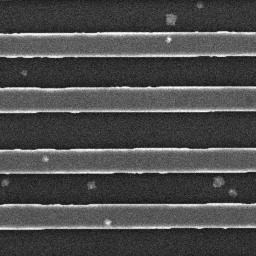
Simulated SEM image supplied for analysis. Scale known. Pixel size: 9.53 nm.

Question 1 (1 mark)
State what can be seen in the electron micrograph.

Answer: lines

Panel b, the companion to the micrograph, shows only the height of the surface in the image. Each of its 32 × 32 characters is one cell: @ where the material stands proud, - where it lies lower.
--------------------------------
--------------------------------
--------------------------------
--------------------------------
@@@@@@@@@@@@@@@@@@@@@@@@@@@@@@@@
@@@@@@@@@@@@@@@@@@@@@@@@@@@@@@@@
@@@@@@@@@@@@@@@@@@@@@@@@@@@@@@@@
--------------------------------
--------------------------------
--------------------------------
--------------------------------
@@@@@@@@@@@@@@@@@@@@@@@@@@@@@@@@
@@@@@@@@@@@@@@@@@@@@@@@@@@@@@@@@
@@@@@@@@@@@@@@@@@@@@@@@@@@@@@@@@
--------------------------------
--------------------------------
--------------------------------
--------------------------------
--------------------------------
@@@@@@@@@@@@@@@@@@@@@@@@@@@@@@@@
@@@@@@@@@@@@@@@@@@@@@@@@@@@@@@@@
@@@@@@@@@@@@@@@@@@@@@@@@@@@@@@@-
--------------------------------
--------------------------------
--------------------------------
--------------------------@@@@@-
@@@@@@@@@@@@@@@@@@@@@@@@@@@@@@@@
@@@@@@@@@@@@@@@@@@@@@@@@@@@@@@@@
@@@@@@@@@@@@@@@@@@@@@@--@@--@---
--------------------------------
--------------------------------
--------------------------------